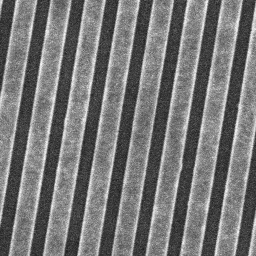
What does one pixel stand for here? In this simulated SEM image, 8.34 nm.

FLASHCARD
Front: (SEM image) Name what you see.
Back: parallel lines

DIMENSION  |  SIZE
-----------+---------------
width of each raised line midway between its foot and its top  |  164 nm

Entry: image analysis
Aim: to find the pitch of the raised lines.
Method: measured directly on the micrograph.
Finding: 0.282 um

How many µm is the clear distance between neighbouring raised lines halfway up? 0.116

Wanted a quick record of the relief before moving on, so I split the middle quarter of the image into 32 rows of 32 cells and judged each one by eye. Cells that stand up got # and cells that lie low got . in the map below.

...####....#####....#####...####
..#####....#####...######...####
..#####....#####....####....####
..#####....#####...#####....####
..#####...######...#####....####
..#####....####....#####....####
..####....#####....#####...#####
.#####....#####....#####...#####
.#####....#####....####....#####
.#####....#####...#####....#####
.#####....####....#####....#####
.#####....####....#####....####.
.####....#####....#####...#####.
.####....#####...######...#####.
#####....#####....####....#####.
#####....#####...#####....#####.
#####....#####...#####....#####.
#####....####....#####....####..
#####...#####....#####...#####..
####....#####....#####...#####..
####....#####....####....#####..
####....#####...#####....#####..
####....#####...#####....#####..
####....####....#####....####...
####...#####....#####...#####...
###....#####....#####...#####...
###....#####....####....#####...
###....#####...#####....#####...
###....#####...#####....#####...
###....####....#####....####....
###...#####....#####...#####....
##....#####....#####...#####....